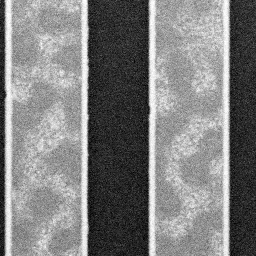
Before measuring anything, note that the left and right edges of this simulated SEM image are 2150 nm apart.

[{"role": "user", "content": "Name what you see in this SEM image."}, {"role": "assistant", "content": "one or a few lines or trenches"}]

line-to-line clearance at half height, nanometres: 571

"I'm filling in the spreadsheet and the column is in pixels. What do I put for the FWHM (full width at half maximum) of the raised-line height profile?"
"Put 75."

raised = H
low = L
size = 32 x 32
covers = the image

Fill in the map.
LHHHHHHHHHHLLLLLLLLHHHHHHHHHLLLL
LHHHHHHHHHHLLLLLLLLHHHHHHHHHLLLL
LHHHHHHHHHHLLLLLLLLHHHHHHHHHLLLL
LHHHHHHHHHHLLLLLLLLHHHHHHHHHLLLL
LHHHHHHHHHHLLLLLLLLHHHHHHHHHLLLL
LHHHHHHHHHHLLLLLLLLHHHHHHHHHLLLL
LHHHHHHHHHHLLLLLLLLHHHHHHHHHLLLL
LHHHHHHHHHHLLLLLLLLHHHHHHHHHLLLL
LHHHHHHHHHHLLLLLLLLHHHHHHHHHLLLL
LHHHHHHHHHHLLLLLLLLHHHHHHHHHLLLL
LHHHHHHHHHHLLLLLLLLHHHHHHHHHLLLL
LHHHHHHHHHHLLLLLLLLHHHHHHHHHLLLL
LHHHHHHHHHHLLLLLLLLHHHHHHHHHLLLL
LHHHHHHHHHHLLLLLLLLHHHHHHHHHLLLL
LHHHHHHHHHHLLLLLLLLHHHHHHHHHLLLL
LHHHHHHHHHHLLLLLLLLHHHHHHHHHLLLL
LHHHHHHHHHHLLLLLLLLHHHHHHHHHLLLL
LHHHHHHHHHHLLLLLLLLHHHHHHHHHLLLL
LHHHHHHHHHHLLLLLLLLHHHHHHHHHLLLL
LHHHHHHHHHHLLLLLLLLHHHHHHHHHLLLL
LHHHHHHHHHHLLLLLLLLHHHHHHHHHLLLL
LHHHHHHHHHHLLLLLLLLHHHHHHHHHLLLL
LHHHHHHHHHHLLLLLLLLHHHHHHHHHLLLL
LHHHHHHHHHHLLLLLLLLHHHHHHHHHLLLL
LHHHHHHHHHHLLLLLLLLHHHHHHHHHLLLL
LHHHHHHHHHHLLLLLLLLHHHHHHHHHLLLL
LHHHHHHHHHHLLLLLLLLHHHHHHHHHLLLL
LHHHHHHHHHHLLLLLLLLHHHHHHHHHLLLL
LHHHHHHHHHHLLLLLLLLHHHHHHHHHLLLL
LHHHHHHHHHHLLLLLLLLHHHHHHHHHLLLL
LHHHHHHHHHHLLLLLLLLHHHHHHHHHLLLL
LHHHHHHHHHHLLLLLLLLHHHHHHHHHLLLL